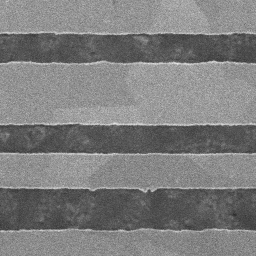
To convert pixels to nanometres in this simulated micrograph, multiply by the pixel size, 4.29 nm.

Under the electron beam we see one or a few lines or trenches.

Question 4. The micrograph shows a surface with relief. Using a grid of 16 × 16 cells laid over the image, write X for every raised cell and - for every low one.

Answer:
XXXXXXXXXXXXXXXX
XXXXXXXXXXXXXXXX
----------------
----------------
XXXXXXXXXXXXXXXX
XXXXXXXXXXXXXXXX
XXXXXXXXXXXXXXXX
XXXXXXXXXXXXXXXX
----------------
----------------
XXXXXXXXXXXXXXXX
XXXXXXXXXXXXXXXX
----------------
----------------
XXXXXXXXXXXXXXXX
XXXXXXXXXXXXXXXX